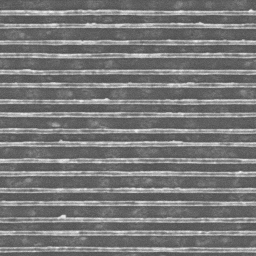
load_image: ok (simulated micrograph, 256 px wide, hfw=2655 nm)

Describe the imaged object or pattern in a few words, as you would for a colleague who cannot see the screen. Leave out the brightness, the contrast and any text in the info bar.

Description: parallel lines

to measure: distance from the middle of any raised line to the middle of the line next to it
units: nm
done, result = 154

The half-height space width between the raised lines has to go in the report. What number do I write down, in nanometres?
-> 109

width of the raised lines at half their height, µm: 0.0363